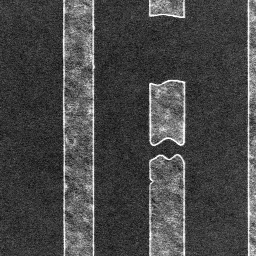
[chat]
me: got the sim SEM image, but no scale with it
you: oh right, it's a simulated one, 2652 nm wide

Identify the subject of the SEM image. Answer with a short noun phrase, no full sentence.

one or a few lines or trenches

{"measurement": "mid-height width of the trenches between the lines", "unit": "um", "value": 0.657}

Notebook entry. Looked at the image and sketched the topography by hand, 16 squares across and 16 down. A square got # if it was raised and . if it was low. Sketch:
....##...##.....
....##..........
....##..........
....##..........
....##..........
....##....##....
....##...###....
....##...###....
....##...##.....
....##..........
....##...##.....
....##...##.....
....##...##.....
....##...##.....
....##...##.....
....##...##.....